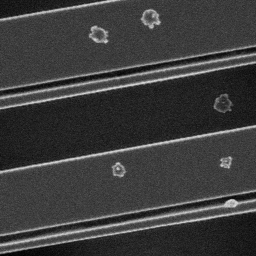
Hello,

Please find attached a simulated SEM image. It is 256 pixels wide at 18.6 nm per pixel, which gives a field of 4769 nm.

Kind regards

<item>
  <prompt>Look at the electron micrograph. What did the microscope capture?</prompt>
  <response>lines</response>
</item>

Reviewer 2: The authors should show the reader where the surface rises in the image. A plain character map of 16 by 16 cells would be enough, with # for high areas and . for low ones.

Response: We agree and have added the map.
....############
################
################
################
############....
#######.........
##..............
................
.............###
.......#########
..##############
################
################
##############..
########........
##..............